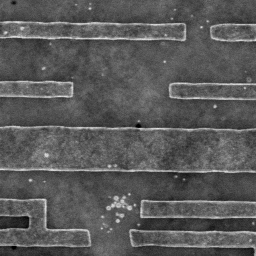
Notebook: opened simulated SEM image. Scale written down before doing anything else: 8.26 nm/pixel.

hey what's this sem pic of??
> wiring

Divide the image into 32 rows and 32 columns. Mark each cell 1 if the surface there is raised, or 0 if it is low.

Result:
00000000000000000000000000000000
00000000000000000000000000000000
00000000000000000000000000000000
11111111111111111111111000111111
11111111111111111111111000111111
00000000000000000000000000000000
00000000000000000000000000000000
00000000000000000000000000000000
00000000000000000000000000000000
00000000000000000000000000000000
11111111100000000000001111111000
11111111100000000000011111111111
00000000000000000000000000000000
00000000000000000000000000000000
00000000000000000000000000000000
00000000000000000000000000000000
11111111111111111111111111111111
11111111111111111111111111111111
11111111111111111111111111111111
11111111111111111111111111111111
11111111111111111111111111111111
00000000000000000000000000001100
00000000000000000000000000000000
00000000000000000000000000000000
00000000000000000000000000000000
11111100000000000011111111111111
11111100000000000011111111111111
00001100000000000000000000000000
00011100000000000000000000000000
11111111111000001111111111111111
11111111111000000111111111111111
00000000000000000000000000000000